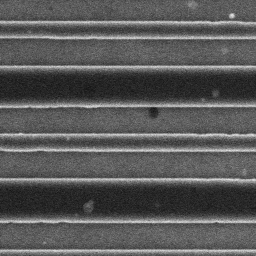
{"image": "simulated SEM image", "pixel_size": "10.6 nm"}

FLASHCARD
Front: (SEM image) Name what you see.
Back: lines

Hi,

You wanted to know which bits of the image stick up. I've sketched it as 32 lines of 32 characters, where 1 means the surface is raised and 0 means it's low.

00000000000000000000000000000000
00000000000000000000000000000000
00000000000000000000000000000000
11111111111111111111111111111111
11111111111111111111111111111111
00000000000000000000000000000000
00000000000000000000000000000000
00000000000000000000000000000000
11111111111111111111111111111111
11111111111111111111111111111111
11111111111111111111111111111111
11111111111111111111111111111111
11111111111111111111111111111111
00000000000000000000000000000000
00000000000000000000000000000000
00000000000000000000000000000000
00000000000000000000000000000000
11111111111111111111111111111111
11111111111111111111111111111111
00000000000000000000000000000000
00000000000000000000000000000000
00000000000000000000000000000000
11111111111111111111111111111101
11111111111111111111111111111111
11111111111111111111111111111111
11111111111111111111111111111111
11111111111111111111111111111111
11111111111111111111111111111111
00000000000000000000000000000000
00000000000000000000000000000000
00000000000000000000000000000000
11111111111111111111111111111111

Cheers